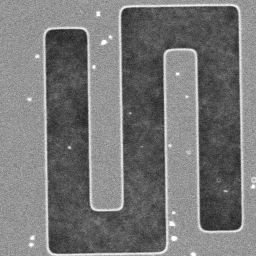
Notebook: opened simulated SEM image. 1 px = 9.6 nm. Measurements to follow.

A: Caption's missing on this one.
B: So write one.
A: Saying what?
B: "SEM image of groups of lines, slits or small figures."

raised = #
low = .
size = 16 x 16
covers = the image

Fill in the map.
########.......#
#######........#
###..###.......#
###...##..##...#
###...##..##...#
###...##..##...#
###...##..##...#
###...##..##...#
###...##..##...#
###...##..##...#
###...##..##...#
###...##..##...#
###...##..##...#
###.......##...#
###.......######
###.......######